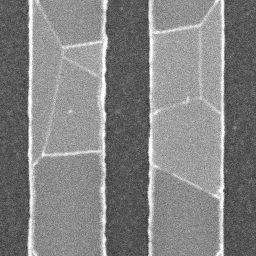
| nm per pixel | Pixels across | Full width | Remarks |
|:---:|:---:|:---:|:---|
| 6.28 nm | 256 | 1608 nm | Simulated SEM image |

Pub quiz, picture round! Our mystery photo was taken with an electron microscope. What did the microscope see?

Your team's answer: one or a few lines or trenches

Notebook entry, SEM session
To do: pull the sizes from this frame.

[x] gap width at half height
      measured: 287 nanometers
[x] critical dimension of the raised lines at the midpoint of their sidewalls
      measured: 74 pixels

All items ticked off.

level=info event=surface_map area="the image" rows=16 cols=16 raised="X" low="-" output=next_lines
--XXXXX--XXXXX--
--XXXXX--XXXXX--
--XXXXX--XXXXX--
--XXXXX--XXXXX--
--XXXXX--XXXXX--
--XXXX---XXXXX--
--XXXX---XXXXX--
--XXXXX--XXXXX--
--XXXX---XXXXX--
--XXXXX--XXXXX--
--XXXXX--XXXXX--
--XXXXX--XXXXX--
--XXXXX--XXXXX--
--XXXXX--XXXXX--
--XXXXX--XXXXX--
--XXXXX--XXXXX--